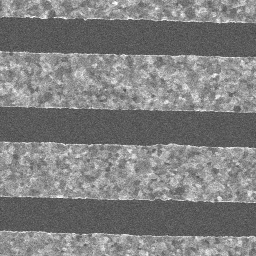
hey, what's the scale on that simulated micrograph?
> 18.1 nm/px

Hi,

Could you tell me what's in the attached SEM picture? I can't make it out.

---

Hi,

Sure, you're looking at one or a few lines or trenches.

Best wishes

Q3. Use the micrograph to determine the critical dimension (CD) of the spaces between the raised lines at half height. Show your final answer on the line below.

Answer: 639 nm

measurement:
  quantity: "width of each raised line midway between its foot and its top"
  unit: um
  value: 0.988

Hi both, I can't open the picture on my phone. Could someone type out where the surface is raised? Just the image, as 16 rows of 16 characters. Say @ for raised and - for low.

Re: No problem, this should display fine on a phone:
@@@@@@@@@@@@@@@@
----------------
----------------
@@@@@@@@@-@@----
@@@@@@@@@@@@@@@@
@@@@@@@@@@@@@@@@
@@@@@@@@@@@@@@@@
----------------
----------------
@@@@@@@@@@@@@@@@
@@@@@@@@@@@@@@@@
@@@@@@@@@@@@@@@@
-----------@@@@@
----------------
@@@-------------
@@@@@@@@@@@@@@@@